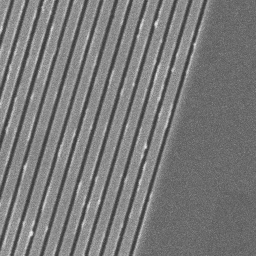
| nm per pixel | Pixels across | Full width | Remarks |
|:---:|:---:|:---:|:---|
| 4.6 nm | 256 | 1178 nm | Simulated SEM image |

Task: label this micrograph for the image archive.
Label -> parallel lines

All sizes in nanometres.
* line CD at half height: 42.4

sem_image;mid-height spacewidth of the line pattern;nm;23.1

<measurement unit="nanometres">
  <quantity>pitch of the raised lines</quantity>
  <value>65.5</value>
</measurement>